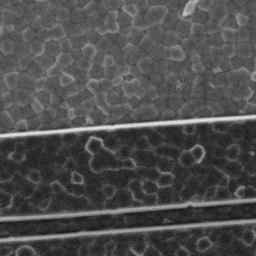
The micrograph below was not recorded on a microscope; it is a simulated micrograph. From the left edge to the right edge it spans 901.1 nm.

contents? one or a few lines or trenches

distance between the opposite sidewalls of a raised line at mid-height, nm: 300